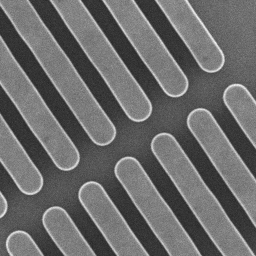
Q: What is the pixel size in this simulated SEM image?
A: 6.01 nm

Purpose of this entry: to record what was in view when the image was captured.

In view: groups of lines, slits or small figures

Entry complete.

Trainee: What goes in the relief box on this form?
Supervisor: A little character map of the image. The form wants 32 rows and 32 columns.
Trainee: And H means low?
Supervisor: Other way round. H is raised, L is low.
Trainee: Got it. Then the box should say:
HHHHLLLHHHLLLHHHHLLLHHHHLLLLLLLL
LHHHHLLHHHHLLLHHHHLLHHHHLLLLLLLL
LHHHHLLLHHHHLLHHHHLLLHHHHLLLLLLL
LLHHHHLLLHHHHLLHHHHLLLHHHHLLLLLL
LLLHHHHLLHHHHLLLHHHHLLHHHHLLLLLL
HLLHHHHLLLHHHHLLHHHHLLLHHHHLLLLL
HLLLHHHHLLLHHHHLLHHHHLLLHHHHLLLL
HHLLLHHHHLLHHHHLLLHHHHLLHHHHLLLL
HHHLLHHHHLLLHHHHLLLHHHHLLHHLLLLL
HHHLLLHHHHLLLHHHHLLHHHHLLLLLLLLL
HHHHLLLHHHHLLHHHHLLLHHHLLLLLLLLL
LHHHHLLHHHHLLLHHHHLLLHHLLLLLHHHL
LHHHHLLLHHHHLLLHHHHLLLLLLLLLHHHH
LLHHHHLLLHHHHLLHHHHLLLLLLLLLLHHH
LLLHHHHLLHHHHLLLHHHLLLLLHHHLLHHH
HLLHHHHLLLHHHHLLLLLLLLLLHHHLLLHH
HHLLHHHHLLLHHHLLLLLLLLLLHHHHLLLH
HHLLLHHHHLLHHHLLLLLHHHLLLHHHHLLH
HHHLLHHHHLLLLLLLLLLHHHHLLHHHHLLL
HHHHLLHHHHLLLLLLLLLHHHHLLLHHHHLL
HHHHLLLHHHLLLLLHHLLLHHHHLLLHHHHL
LHHHHLLLLLLLLLHHHHLLLHHHHLLHHHHL
LLHHHLLLLLLLLLLHHHHLLHHHHLLLHHHH
LLHHHLLLLLHHHLLLHHHLLLHHHHLLLHHH
LLLLLLLLLLHHHLLLHHHHLLLHHHHLLHHH
HLLLLLLLLLHHHHLLLHHHHLLHHHHLLLHH
HLLLLLHHLLLHHHHLLHHHHHLLHHHHLLLH
LLLLLHHHHLLLHHHHLLHHHHLLLHHHHLLH
LLLLLLHHHHLLHHHHLLLHHHHLLHHHHLLL
LHHHLLHHHHLLLHHHHLLLHHHHLLHHHHLL
LHHHLLLHHHHLLLHHHHLLHHHHLLLHHHHL
LHHHHLLLHHHHLLHHHHLLLHHHHLLLHHHH